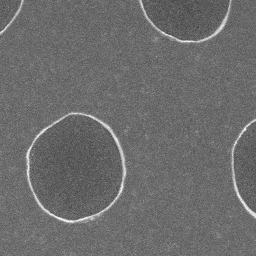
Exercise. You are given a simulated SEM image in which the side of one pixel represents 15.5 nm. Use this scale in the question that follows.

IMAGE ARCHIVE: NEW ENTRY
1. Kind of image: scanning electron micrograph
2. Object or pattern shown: holes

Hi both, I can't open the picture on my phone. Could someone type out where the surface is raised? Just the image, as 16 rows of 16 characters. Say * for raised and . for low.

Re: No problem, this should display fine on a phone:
.********.....**
.*********....**
***********..***
****************
****************
****************
****************
****..**********
**.....********.
**......*******.
**......*******.
**......*******.
**.....********.
***...**********
****************
****************